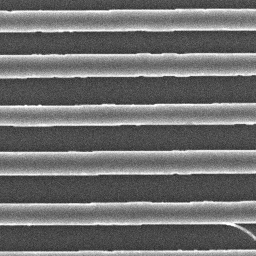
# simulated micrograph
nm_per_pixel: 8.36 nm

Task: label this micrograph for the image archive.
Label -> lines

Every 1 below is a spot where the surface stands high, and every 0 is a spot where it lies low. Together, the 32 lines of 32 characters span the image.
00000000000000000000000000000000
10111111111111111111111111111111
11111111111111111111111111111111
11111111111111111111111111111111
00000000000000000000000000000000
00000000000000000000000000000000
00000000000000000000000000000000
11111111111111111111111111111111
11111111111111111111111111111111
11111111111111111111101100000000
00000000000000000000000000000000
00000000000000000000000000000000
00000000000000000000000000000000
11111111111111111111111111111111
11111111111111111111111111111111
11111111111111111111111011100000
00000000000000000000000000000000
00000000000000000000000000000000
00000000000000000000000000000000
11111111111111111111111111111111
11111111111111111111111111111111
11111111111111111111111111111111
00000000000000000000000000000000
00000000000000000000000000000000
00000000000000000000000000000000
00000000000111111111111111111111
11111111111111111111111111111111
11111111111111111111111111111111
00000000000000000000000000000000
00000000000000000000000000000000
00000000000000000000000000000000
00000000001110111111111111111111